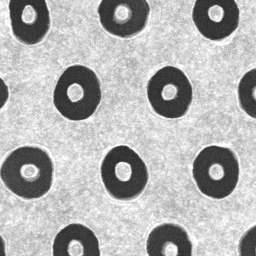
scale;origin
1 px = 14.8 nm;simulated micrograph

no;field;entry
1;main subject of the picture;ring-shaped grooves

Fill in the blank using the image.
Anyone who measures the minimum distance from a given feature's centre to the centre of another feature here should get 1.36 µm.